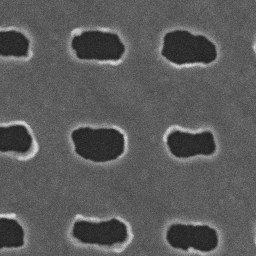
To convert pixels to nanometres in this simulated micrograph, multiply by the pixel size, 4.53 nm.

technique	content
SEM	holes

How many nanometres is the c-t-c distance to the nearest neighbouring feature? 405